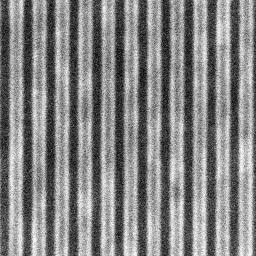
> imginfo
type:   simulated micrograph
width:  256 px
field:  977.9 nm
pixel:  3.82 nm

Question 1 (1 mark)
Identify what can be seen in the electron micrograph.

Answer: wiring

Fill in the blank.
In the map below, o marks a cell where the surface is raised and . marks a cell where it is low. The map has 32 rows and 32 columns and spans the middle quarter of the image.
o...ooo...ooo..ooo...ooo...ooo..
o...ooo...ooo..ooo...ooo...ooo..
o...ooo...ooo..ooo...ooo...ooo..
o...ooo...ooo..ooo...ooo...ooo..
o...ooo...ooo..ooo...ooo...ooo..
o...ooo...ooo..ooo...ooo...ooo..
o...ooo...ooo..ooo...ooo...ooo..
o...ooo...ooo..ooo...ooo...ooo..
o...ooo...ooo..ooo...ooo...ooo..
o...ooo...ooo..ooo...ooo...ooo..
o...ooo...ooo..ooo...ooo...ooo..
o...ooo...ooo..ooo...ooo...ooo..
o...ooo...ooo..ooo...ooo...ooo..
o...ooo...ooo..ooo...ooo...ooo..
o...ooo...ooo..ooo...ooo...ooo..
o...ooo...ooo..ooo...ooo...ooo..
o...ooo...ooo..ooo...ooo...ooo..
o...ooo...ooo..ooo...ooo...ooo..
o...ooo...ooo..ooo...ooo...ooo..
o...ooo...ooo..ooo...ooo...ooo..
o...ooo...ooo..ooo...ooo...ooo..
o...ooo...ooo..ooo...ooo...ooo..
o...ooo...ooo..ooo...ooo...ooo..
o...ooo...ooo..ooo...ooo...ooo..
o...ooo...ooo..ooo...ooo...ooo..
o...ooo...ooo..ooo...ooo...ooo..
o...ooo...ooo..ooo...ooo...ooo..
o...ooo...ooo..ooo...ooo...ooo..
o...ooo...ooo..ooo...ooo...ooo..
o...ooo...ooo..ooo...ooo...ooo..
o...ooo...oo...ooo...ooo...ooo..
o...ooo...oo...ooo...ooo...ooo..